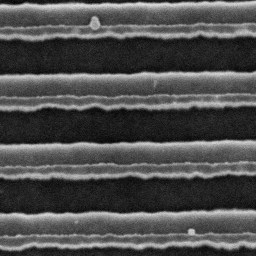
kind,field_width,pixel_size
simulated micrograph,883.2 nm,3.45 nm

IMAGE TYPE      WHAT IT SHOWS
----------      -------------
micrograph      lines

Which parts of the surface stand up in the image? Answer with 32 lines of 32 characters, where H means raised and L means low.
LLLLLLLLLLLLLLLLHHHLHLHHHHHHHHHH
HHHHHHHHHHHHHHHHHHHHHHHHHHHHHHHH
HHHHHHHHHHHHHHHHHHHHHHHHHHHHHHHH
HHHHHHHHHHHHHHHHHHHHHHHHHHHHHHHH
HLLHHHLLLLLLLLLLLLLLLLLLLLLLLLLL
LLLLLLLLLLLLLLLLLLLLLLLLLLLLLLLL
LLLLLLLLLLLLLLLLLLLLLLLLLLLLLLLL
LLLLLLLLLLLLLLLLLLLLLLLLLLLLLLLL
LLLLLLLLLLLLLLLLLLLLLLLLLLLLLLLL
HLHHHHHHHHHHHHHHHHHHHHHHHHHHHHHH
HHHHHHHHHHHHHHHHHHHHHHHHHHHHHHHH
HHHHHHHHHHHHHHHHHHHHHHHHHHHHHHHH
HHHHHHHHHHHHHHHHHHHHHHHHHHHHHHHH
HHHHHLLLLLLLLLLLLLLLLLLLLLLLLLLL
LLLLLLLLLLLLLLLLLLLLLLLLLLLLLLLL
LLLLLLLLLLLLLLLLLLLLLLLLLLLLLLLL
LLLLLLLLLLLLLLLLLLLLLLLLLLLLLLLL
LLLLLLLLLLLLLLLLLLLLLLLLLLLLLLLL
HHHHHHHHHHHHHHHHHHHHHHHHHHHHHHHH
HHHHHHHHHHHHHHHHHHHHHHHHHHHHHHHH
HHHHHHHHHHHHHHHHHHHHHHHHHHHHHHHH
HHHHHHHHHHHHHHHHHHHHHHHHHHHHHHHH
LLLLLLLLLLLLLLLLLLLLLLLLLLLLLLLL
LLLLLLLLLLLLLLLLLLLLLLLLLLLLLLLL
LLLLLLLLLLLLLLLLLLLLLLLLLLLLLLLL
LLLLLLLLLLLLLLLLLLLLLLLLLLLLLLLL
LLLLLLLLLLLLLLLLLLLLLLLHHHHHHHHH
HHHHHHHHHHHHHHHHHHHHHHHHHHHHHHHH
HHHHHHHHHHHHHHHHHHHHHHHHHHHHHHHH
HHHHHHHHHHHHHHHHHHHHHHHHHHHHHHHH
HHHHHHHHHHHHHHHHHHHHHLLLLLLHHHLH
LLLLLLLLLLLLLLLLLLLLLLLLLLLLLLLL